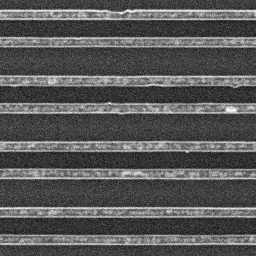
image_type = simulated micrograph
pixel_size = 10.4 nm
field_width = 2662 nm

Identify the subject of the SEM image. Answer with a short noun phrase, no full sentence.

parallel lines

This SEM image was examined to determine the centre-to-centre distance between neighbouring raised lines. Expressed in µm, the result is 0.334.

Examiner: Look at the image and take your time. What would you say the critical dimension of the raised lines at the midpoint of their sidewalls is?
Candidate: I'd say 97.5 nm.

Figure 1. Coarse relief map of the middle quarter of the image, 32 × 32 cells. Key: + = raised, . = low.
................................
................................
................................
++++++++++++++++++++++++++++++++
++++++++++++++++++++++++++++++++
................................
................................
................................
................................
................................
++++++++++++++++++++++++++++++++
++++++++++++++++++++++++++++++++
................................
................................
................................
................................
................................
................................
................................
..........++++++++++++++++++++++
++++++++++++++++++++++++++++++++
++++++++++++++++++++++++++++++++
................................
................................
................................
................................
+++++++++++++............+++++++
++++++++++++++++++++++++++++++++
++++++++++++++++++++++++++++++++
................................
................................
................................